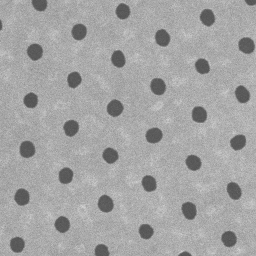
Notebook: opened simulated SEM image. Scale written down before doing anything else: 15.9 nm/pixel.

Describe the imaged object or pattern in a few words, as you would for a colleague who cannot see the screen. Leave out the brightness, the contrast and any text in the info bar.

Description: a regular array of holes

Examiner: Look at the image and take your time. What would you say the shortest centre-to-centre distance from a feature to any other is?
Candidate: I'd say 762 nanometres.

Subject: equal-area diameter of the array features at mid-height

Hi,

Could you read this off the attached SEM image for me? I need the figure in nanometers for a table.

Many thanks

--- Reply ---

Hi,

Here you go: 256